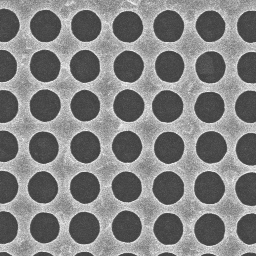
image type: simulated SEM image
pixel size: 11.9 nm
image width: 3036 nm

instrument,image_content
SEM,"a regular array of holes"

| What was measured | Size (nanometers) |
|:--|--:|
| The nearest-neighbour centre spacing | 473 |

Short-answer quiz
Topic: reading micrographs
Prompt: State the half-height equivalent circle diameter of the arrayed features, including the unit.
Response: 373 nm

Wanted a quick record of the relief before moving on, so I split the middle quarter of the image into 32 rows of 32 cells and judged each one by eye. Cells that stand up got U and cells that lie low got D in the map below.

UDDDDDDDDUUUDDDDDDDDUUUDDDDDDDUU
UUDDDDDDDUUUDDDDDDDDUUUDDDDDDDUU
UUDDDDDDDUUUUDDDDDDUUUUDDDDDDDUU
UUUDDDDDUUUUUUDDDDDUUUUUDDDDDUUU
UUUUDDUUUUUUUUUDDUUUUUUUUDDDUUUU
UUUUUUUUUUUUUUUUUUUUUUUUUUUUUUUU
UUUUUDUUUUUUUUUDDUUUUUUUUDUUUUUU
UUUDDDDDUUUUUDDDDDDUUUUDDDDDUUUU
UUDDDDDDDUUUUDDDDDDDUUUDDDDDDUUU
UUDDDDDDDUUUUDDDDDDDUUDDDDDDDDUU
UUDDDDDDDUUUDDDDDDDDUUDDDDDDDDUU
UUDDDDDDDUUUDDDDDDDDUUDDDDDDDDUU
UUDDDDDDDUUUUDDDDDDDUUDDDDDDDDUU
UUUDDDDDUUUUUUDDDDDUUUUDDDDDDUUU
UUUUUUUUUUUUUUUUDUUUUUUUUDDUUUUU
UUUUUUUUUUUUUUUUUUUUUUUUUUUUUUUU
UUUUUUUUUUUUUUUUUUUUUUUUUUUUUUUU
UUUDDDDUUUUUUDDDDDUUUUUUDDDDUUUU
UUDDDDDDUUUUDDDDDDDUUUUDDDDDDDUU
UUDDDDDDDUUUDDDDDDDUUUUDDDDDDDUU
UUDDDDDDDUUUDDDDDDDDUUDDDDDDDDUU
UUDDDDDDDUUUDDDDDDDDUUDDDDDDDDUU
UUDDDDDDDUUUDDDDDDDUUUUDDDDDDDUU
UUUDDDDDUUUUUDDDDDUUUUUDDDDDDUUU
UUUUDDDUUUUUUUUDDUUUUUUUUDDDUUUU
UUUUUUUUUUUUUUUUUUUUUUUUUUUUUUUU
UUUUUUUUUUUUUUUUUUUUUUUUUUUUUUUU
UUUDDDDUUUUUUUDDDDUUUUUUDDDDUUUU
UUDDDDDDUUUUUDDDDDDUUUUDDDDDDUUU
UUDDDDDDDUUUDDDDDDDUUUDDDDDDDDUU
UDDDDDDDDUUUDDDDDDDUUUDDDDDDDDUU
UDDDDDDDDUUUDDDDDDDUUUDDDDDDDDUU